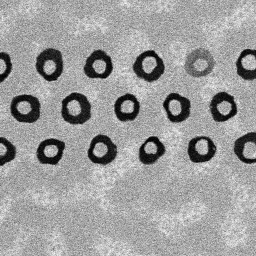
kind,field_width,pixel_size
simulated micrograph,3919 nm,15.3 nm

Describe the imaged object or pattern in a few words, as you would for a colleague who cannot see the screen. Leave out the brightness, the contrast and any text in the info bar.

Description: a regular array of ring-shaped grooves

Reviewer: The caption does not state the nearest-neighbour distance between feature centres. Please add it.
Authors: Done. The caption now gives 0.742 um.